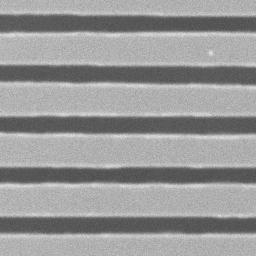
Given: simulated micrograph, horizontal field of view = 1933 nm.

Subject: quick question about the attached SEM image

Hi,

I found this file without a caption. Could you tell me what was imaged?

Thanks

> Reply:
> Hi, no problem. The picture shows lines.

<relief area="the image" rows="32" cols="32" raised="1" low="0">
11111111111111111111111111111111
11111111111111111111111111111111
00000000000000000000000000000000
00000000000000000000000000000000
11111111111111111111111111111111
11111111111111111111111111111111
11111111111111111111111111111111
11111111111111111111111111111111
00000000000000000000000000000000
00000000000000000000000000000000
11111111111111110000000000000000
11111111111111111111111111111111
11111111111111111111111111111111
11111111111111111111111111111111
00000000000000000000000000000000
00000000000000000000000000000000
00000000000000000000000000000000
11111111111111111111111111111111
11111111111111111111111111111111
11111111111111111111111111111111
11111111111111111111111111111111
00000000000000000000000000000000
00000000000000000000000000000000
11111111111111111111111111111111
11111111111111111111111111111111
11111111111111111111111111111111
11111111111111111111111111111111
00000000000000000000000000000000
00000000000000000000000000000000
11111111111111111111111111111111
11111111111111111111111111111111
11111111111111111111111111111111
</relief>